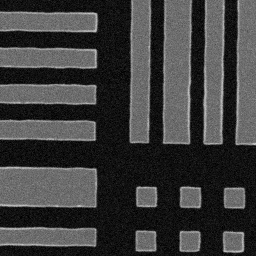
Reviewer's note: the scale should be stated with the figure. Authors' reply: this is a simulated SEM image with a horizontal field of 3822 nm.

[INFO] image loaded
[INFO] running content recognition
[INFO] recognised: groups of lines, slits or small figures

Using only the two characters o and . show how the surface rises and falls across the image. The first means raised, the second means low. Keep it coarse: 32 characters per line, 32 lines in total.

................ooo..ooo..oo..oo
.................oo..ooo..oo..oo
oooooooooooo....ooo..ooo..oo..oo
oooooooooooo....ooo..ooo..oo..oo
................ooo..ooo..oo..oo
................ooo..ooo..oo..oo
oooooooooooo....ooo..ooo..oo..oo
oooooooooooo....ooo..ooo..oo..oo
................ooo..ooo..oo..oo
................ooo..ooo..oo..oo
................ooo..ooo..oo..oo
oooooooooooo....ooo..ooo..oo..oo
oooooooooooo....ooo..ooo..oo..oo
................ooo..ooo..oo..oo
................ooo.oooo..oo..oo
oooooooooooo....ooo..ooo..oo..oo
oooooooooooo....ooo..ooo..oo..oo
..........oo....ooo..ooo..oo..oo
................................
................................
................................
oooooooooooo....................
oooooooooooo....................
oooooooooooo.....oo....oo.......
oooooooooooo.....ooo...oo...oo..
oooooooooooo.....oo....oo...oo..
................................
................................
....oo..........................
oooooooooooo.....oo....oo...oo..
oooooooooooo.....oo....oo...oo..
................................